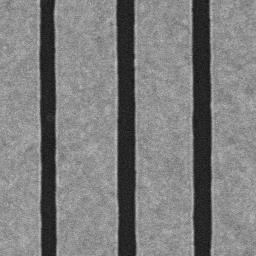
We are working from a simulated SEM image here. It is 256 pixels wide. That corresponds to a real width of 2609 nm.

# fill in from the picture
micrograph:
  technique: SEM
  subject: wiring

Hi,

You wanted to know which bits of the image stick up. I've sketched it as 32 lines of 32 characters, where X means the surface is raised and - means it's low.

XXXXX--XXXXXXXX--XXXXXXX--XXXXXX
XXXXX--XXXXXXX---XXXXXXX--XXXXXX
XXXXX--XXXXXXX---XXXXXXX--XXXXXX
XXXXX--XXXXXXXX--XXXXXXX--XXXXXX
XXXXX--XXXXXXXX--XXXXXXX--XXXXXX
XXXXX--XXXXXXXX--XXXXXXX--XXXXXX
XXXXX--XXXXXXXX--XXXXXXX--XXXXXX
XXXXX--XXXXXXXX--XXXXXXX--XXXXXX
XXXXX--XXXXXXXX--XXXXXXX--XXXXXX
XXXXX--XXXXXXXX--XXXXXXX--XXXXXX
XXXXX--XXXXXXXX--XXXXXXX--XXXXXX
XXXXX--XXXXXXXX--XXXXXXX---XXXXX
XXXXX--XXXXXXXX--XXXXXXX---XXXXX
XXXXX--XXXXXXXX--XXXXXXX---XXXXX
XXXXX--XXXXXXXX--XXXXXXX---XXXXX
XXXXX--XXXXXXXX--XXXXXXX---XXXXX
XXXXX--XXXXXXXX--XXXXXXX---XXXXX
XXXXX--XXXXXXXX--XXXXXXX---XXXXX
XXXXX--XXXXXXXX--XXXXXXX---XXXXX
XXXXX--XXXXXXXX--XXXXXXX---XXXXX
XXXXX--XXXXXXXX--XXXXXXX---XXXXX
XXXXX--XXXXXXXX--XXXXXXX---XXXXX
XXXXX--XXXXXXXX--XXXXXXX---XXXXX
XXXXX--XXXXXXXX--XXXXXXX---XXXXX
XXXXX--XXXXXXXX--XXXXXXX---XXXXX
XXXXX--XXXXXXXX--XXXXXXX---XXXXX
XXXXX--XXXXXXXX--XXXXXXX---XXXXX
XXXXX--XXXXXXXX--XXXXXXX---XXXXX
XXXXX--XXXXXXXX--XXXXXXX---XXXXX
XXXXX--XXXXXXXX--XXXXXXX---XXXXX
XXXXX--XXXXXXXX--XXXXXXX---XXXXX
XXXXX--XXXXXXXX--XXXXXXX---XXXXX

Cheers